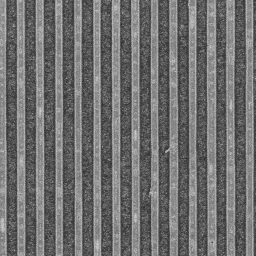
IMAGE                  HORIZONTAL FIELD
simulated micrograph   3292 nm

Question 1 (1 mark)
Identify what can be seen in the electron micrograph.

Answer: parallel lines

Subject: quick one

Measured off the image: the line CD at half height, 80.3 nanometres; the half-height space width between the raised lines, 0.161 micrometres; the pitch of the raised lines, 245 nanometers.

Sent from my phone